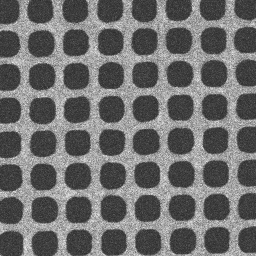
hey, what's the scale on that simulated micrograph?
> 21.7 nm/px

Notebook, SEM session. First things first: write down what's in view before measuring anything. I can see a regular array of holes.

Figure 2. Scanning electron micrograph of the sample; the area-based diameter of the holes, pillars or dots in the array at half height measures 609 nanometers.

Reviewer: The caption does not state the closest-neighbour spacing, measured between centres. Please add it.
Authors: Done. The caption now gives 721 nanometers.